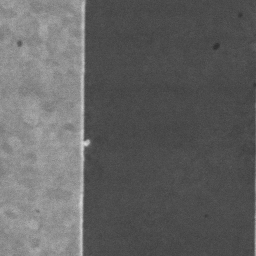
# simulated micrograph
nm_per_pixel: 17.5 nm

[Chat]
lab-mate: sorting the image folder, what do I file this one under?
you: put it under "wiring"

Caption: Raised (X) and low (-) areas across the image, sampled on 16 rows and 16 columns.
XXXXX-----------
XXXXX-----------
XXXXX-----------
XXXXX-----------
XXXXX-----------
XXXXX-----------
XXXXX-----------
XXXXX-----------
XXXXX-----------
XXXXX-----------
XXXXX-----------
XXXXX-----------
XXXXX-----------
XXXXX-----------
XXXXX-----------
XXXXX-----------